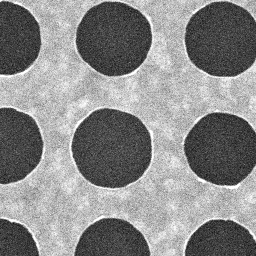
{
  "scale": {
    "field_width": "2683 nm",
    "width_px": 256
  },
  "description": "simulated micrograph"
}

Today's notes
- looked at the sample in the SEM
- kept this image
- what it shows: holes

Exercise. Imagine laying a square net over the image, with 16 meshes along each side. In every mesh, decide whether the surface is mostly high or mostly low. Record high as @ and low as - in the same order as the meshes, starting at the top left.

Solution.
--@@@@--@@@@@--@
--@@@----@@@----
---@@----@@@----
--@@@----@@@----
-@@@@@--@@@@@--@
@@@@@@@@@@@@@@@@
@@@@@@@@@@@@@@@@
--@@@----@@@---@
---@@----@@@----
---@@----@@@----
--@@@----@@@----
@@@@@@--@@@@@--@
@@@@@@@@@@@@@@@@
@@@@@@@@@@@@@@@@
--@@@----@@@----
--@@@----@@@----